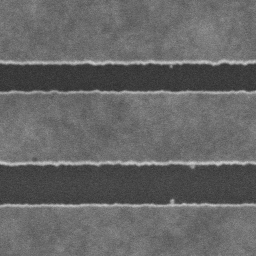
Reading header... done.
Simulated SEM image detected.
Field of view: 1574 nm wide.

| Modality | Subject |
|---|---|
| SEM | lines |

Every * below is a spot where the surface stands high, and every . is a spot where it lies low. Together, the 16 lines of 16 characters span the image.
****************
****************
****************
****************
................
................
****************
****************
****************
****************
................
................
................
****************
****************
****************